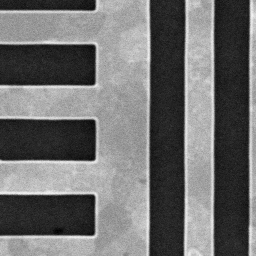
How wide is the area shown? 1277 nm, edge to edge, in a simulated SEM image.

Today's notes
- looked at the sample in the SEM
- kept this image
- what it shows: groups of lines, slits or small figures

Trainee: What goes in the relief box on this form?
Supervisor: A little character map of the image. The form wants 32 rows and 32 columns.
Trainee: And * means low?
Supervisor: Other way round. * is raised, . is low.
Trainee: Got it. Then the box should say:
............******.....****....*
******************.....****....*
*******************....****....*
*******************....****....*
*******************....***.....*
............*******....****....*
............*******....****....*
............*******....****....*
............*******....****....*
............*******....****....*
............*******....****....*
*******************....****....*
*******************....****....*
*******************....****....*
*******************....****....*
............******.....****....*
............******.....****....*
............******.....****....*
............******.....***.....*
............******.....****....*
******************.....****....*
******************.....****....*
******************.....****....*
******************.....****....*
............******.....****....*
............******.....***.....*
............******.....***.....*
............******.....***.....*
............******.....***.....*
............******.....***.....*
******************.....***.....*
******************.....***.....*